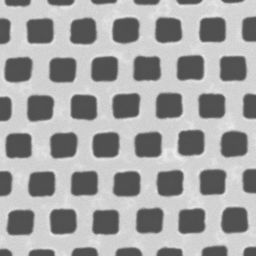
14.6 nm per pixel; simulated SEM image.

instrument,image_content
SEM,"a regular array of holes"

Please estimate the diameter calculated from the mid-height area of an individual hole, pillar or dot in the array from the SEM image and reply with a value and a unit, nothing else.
413 nm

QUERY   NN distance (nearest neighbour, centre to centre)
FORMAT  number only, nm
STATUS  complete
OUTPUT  621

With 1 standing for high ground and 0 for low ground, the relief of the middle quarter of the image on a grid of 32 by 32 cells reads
00011110000000111100000011110000
00011110000000111100000011110000
00011110000001111000000011110000
00011110000001111100000011110000
00111111111011111111111111111111
11111111111111111111111111111111
11111111111111111111111111111111
11111111111110000001111100000111
11000000111100000001111000000011
10000000111100000001111000000111
11000000111100000001111000000111
10000000111100000001111000000011
10000000111100000001111000000111
11000000111110001111111101101111
11111111111111111111111111111111
11111111111111111111111111111111
11111111111111111111111111111100
00011111000000111100000011111000
00011110000000111100000011111000
00011110000000111000000011111000
00011110000000111100000011111000
00011110000000111100000011111000
00011110000000111100000011111000
11111111111111111111100111111111
11111111111111111111111111111111
11111111111111111111111111111111
11111111111111111111111111100111
11000000111110000001111000000011
11000000011100000001111000000011
11000000011100000001111000000011
11000000111100000001111000000011
11000000111100000001111000000011